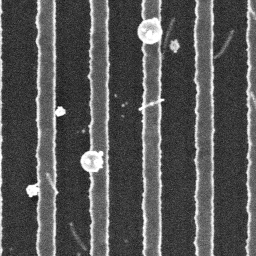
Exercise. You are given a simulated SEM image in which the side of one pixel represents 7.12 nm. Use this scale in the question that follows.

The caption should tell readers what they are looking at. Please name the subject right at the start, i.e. lines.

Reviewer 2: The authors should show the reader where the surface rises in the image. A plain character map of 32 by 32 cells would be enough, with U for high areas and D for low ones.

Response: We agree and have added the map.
DDDDDUUDDDDUUDDDDDUUDDDDDUUDDDDU
DDDDDUUDDDDUUUDDDDUUDDDDUUUDDDDU
DDDDDUUDDDDUUUDDDDUUDDDDUUUDDDDU
DDDDDUUDDDDUUDDDDUUUDDDDUUUDDDDU
DDDDDUUDDDDUUUDDDUUUDDDDUUUDDDDU
DDDDDUUDDDDUUUDDDDUUDDDDUUUDDDDU
DDDDDUUDDDDUUUDDDDUUDDDDUUUDDDDU
DDDDDUUDDDDUUUDDDDUUDDDDUUUDDDDU
DDDDDUUDDDDUUUDDDDUUDDDDUUUDDDDU
DDDDDUUDDDDUUUDDDDUUDDDDUUUDDDDU
DDDDDUUDDDDUUDDDDDUUDDDDDUUDDDDU
DDDDDUUDDDDUUUDDDDUUDDDDDUUDDDDU
DDDDDUUDDDDUUUDDDDUUDDDDDUUDDDDU
DDDDDUUDDDDUUUDDDDUUDDDDUUUDDDDU
DDDDDUUDDDDUUUDDDDUUDDDDDUUDDDDU
DDDDDUUDDDDUUDDDDDUUDDDDUUUDDDDU
DDDDDUUDDDDUUDDDDDUUDDDDUUUDDDDU
DDDDDUUDDDDUUUDDDDUUDDDDUUUDDDDU
DDDDDUUDDDDUUUDDDDUUDDDDDUUDDDDU
DDDDDUUDDDUUUUDDDDUUDDDDUUUDDDDU
DDDDDUUDDDUUUUDDDDUUDDDDUUUDDDDU
DDDDDUUDDDDUUUDDDDUUDDDDDUUDDDDU
DDDDDUUDDDDUUUDDDDUUDDDDDUUDDDDU
DDDUUUUDDDDUUUDDDDUUDDDDUUUDDDDU
DDDDDUUDDDDUUUDDDDUUDDDDUUUDDDDU
DDDDDUUDDDDUUUDDDDUUDDDDUUUDDDDU
DDDDDUUDDDDUUUDDDDUUDDDDUUUDDDDU
DDDDDUUDDDDUUUDDDDUUDDDDUUUDDDDU
DDDDDUUDDDDUUUDDDDUUDDDDDUUDDDDU
DDDDDUUDDDDUUUDDDDUUDDDDUUUDDDDU
DDDDDUUDDDDUUUDDDDUUDDDDUUUDDDDU
DDDDDUUDDDDUUUDDDDUUDDDDDUUDDDDU